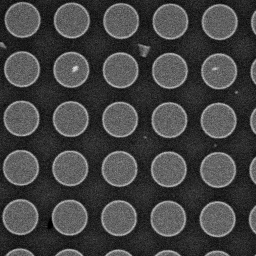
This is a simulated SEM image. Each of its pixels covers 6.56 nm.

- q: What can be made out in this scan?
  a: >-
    an array of small figures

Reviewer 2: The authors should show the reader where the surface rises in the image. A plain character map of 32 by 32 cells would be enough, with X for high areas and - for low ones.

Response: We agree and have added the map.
--XX----XX-----X----------------
-XXXX--XXXX--XXXX--XXXX---XXX---
-XXXX--XXXX--XXXX--XXXXX-XXXXX-X
-XXXX--XXXX--XXXX--XXXX--XXXXX--
--XX----XX----XX----XXX---XXX---
--------------------------------
--X-----------------------------
-XXXX--XXXX--XXXX--XXXX---XXX---
-XXXX--XXXX--XXXX--XXXX--XXXXX-X
-XXXX--XXXX--XXXX--XXXX--XXXX--X
--XX----XX----XX----XXX---XXX---
--------------------------------
--------------------------------
-XXX---XXXX--XXXX---XXX---XXX---
-XXXX--XXXX--XXXX--XXXX--XXXX--X
-XXXX--XXXX--XXXX--XXXX--XXXXX-X
-XXX---XXX---XXXX---XXX---XXX---
--------------------------------
--------------------------------
-XXX---XXX---XXX----XX----XXX---
XXXXX--XXXX--XXXX--XXXX--XXXX--X
XXXXX--XXXX--XXXX--XXXX--XXXX--X
-XXX---XXX---XXXX--XXXX--XXXX---
--------------------------------
--------------------------------
-XXX---XXX----XX----XX----XX----
XXXXX--XXXX--XXXX--XXXX--XXXX--X
XXXXX--XXXX--XXXX--XXXX--XXXX--X
-XXX---XXX---XXXX--XXXX--XXXX--X
--------------------XX-----X----
--------------------------------
-XXX----XX----XX----XX----XX----